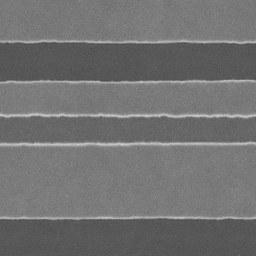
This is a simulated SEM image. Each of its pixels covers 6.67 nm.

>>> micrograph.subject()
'lines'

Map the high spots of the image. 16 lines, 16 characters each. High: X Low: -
XXXXXXXXXXXXXXXX
XXXXXXXXXXXXXXXX
XXXXXXXXXXXXXXXX
----------------
----------------
XXXXXXXXXXXXXXXX
XXXXXXXXXXXXXXXX
XXXXXXXXXXXXXXXX
XXXXXXXXXXXXXXXX
XXXXXXXXXXXXXXXX
XXXXXXXXXXXXXXXX
XXXXXXXXXXXXXXXX
XXXXXXXXXXXXXXXX
XXXXXXXXXXXXXXXX
----------------
----------------